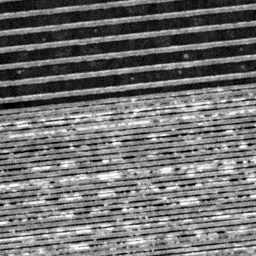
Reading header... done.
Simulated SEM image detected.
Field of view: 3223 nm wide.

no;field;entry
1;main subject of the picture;parallel lines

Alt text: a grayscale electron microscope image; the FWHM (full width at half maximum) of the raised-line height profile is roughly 50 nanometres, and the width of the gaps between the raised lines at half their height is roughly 12.5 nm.